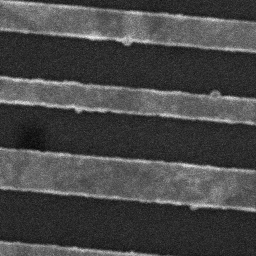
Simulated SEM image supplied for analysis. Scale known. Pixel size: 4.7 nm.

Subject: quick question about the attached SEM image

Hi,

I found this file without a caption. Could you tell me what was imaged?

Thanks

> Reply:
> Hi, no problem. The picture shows one or a few lines or trenches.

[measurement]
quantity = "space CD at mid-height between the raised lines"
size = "218 nanometers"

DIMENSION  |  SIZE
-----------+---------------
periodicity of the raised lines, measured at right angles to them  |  360 nm